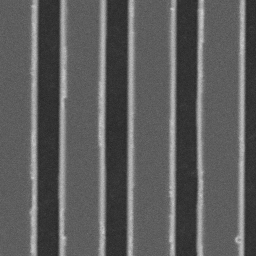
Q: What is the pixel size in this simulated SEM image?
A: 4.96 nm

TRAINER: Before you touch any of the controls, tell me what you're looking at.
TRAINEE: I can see one or a few lines or trenches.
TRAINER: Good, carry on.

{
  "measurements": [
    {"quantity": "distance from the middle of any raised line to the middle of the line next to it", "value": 344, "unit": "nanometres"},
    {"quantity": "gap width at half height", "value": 137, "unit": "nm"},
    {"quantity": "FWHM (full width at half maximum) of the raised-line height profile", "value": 208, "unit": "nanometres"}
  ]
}